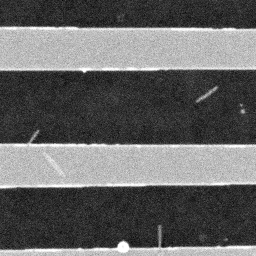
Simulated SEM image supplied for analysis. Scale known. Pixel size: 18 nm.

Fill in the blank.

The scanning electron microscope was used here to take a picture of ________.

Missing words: lines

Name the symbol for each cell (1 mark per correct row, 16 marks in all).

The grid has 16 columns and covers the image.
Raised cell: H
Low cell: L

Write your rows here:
LLLLLLLLLLLLLLLL
LLLLLLLLLLLLLLLL
HHHHHHHHHHHHHHHH
HHHHHHHHHHHHHHHH
LLLLLLLLLLLLLLLL
LLLLLLLLLLLLLLLL
LLLLLLLLLLLLLLLL
LLLLLLLLLLLLLLLL
LLLLLLLLLLLLLLLL
HHHHHHHHHHHHHHHH
HHHHHHHHHHHHHHHH
HHHHHHHHHHHHHHHL
LLLLLLLLLLLLLLLL
LLLLLLLLLLLLLLLL
LLLLLLLLLLLLLLLL
LLLLLLLHHHHHHHHH